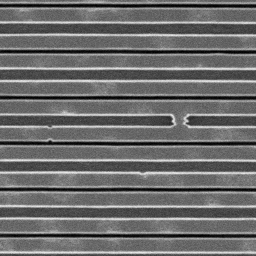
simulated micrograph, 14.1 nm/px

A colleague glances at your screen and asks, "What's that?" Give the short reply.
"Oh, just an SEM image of parallel lines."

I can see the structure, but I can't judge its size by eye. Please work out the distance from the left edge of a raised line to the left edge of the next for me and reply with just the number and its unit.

325 nanometres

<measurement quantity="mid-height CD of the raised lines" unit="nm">207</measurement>